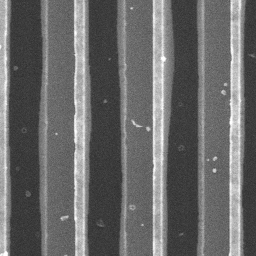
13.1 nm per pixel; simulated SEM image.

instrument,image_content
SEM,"lines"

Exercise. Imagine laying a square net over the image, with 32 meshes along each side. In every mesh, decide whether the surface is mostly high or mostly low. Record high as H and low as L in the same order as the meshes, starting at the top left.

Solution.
HLLLLLHHHHHLLLLHHHHHHLLLLHHHHHLL
HLLLLLHHHHHLLLLHHHHHHLLLLHHHHHLL
HLLLLLHHHHHLLLLHHHHHHLLLLHHHHHLL
HLLLLLHHHHHLLLLHHHHHHLLLLHHHHHLL
HLLLLLHHHHHLLLLHHHHHHLLLLHHHHHLL
HLLLLLHHHHHLLLLHHHHHHLLLLHHHHHLL
HLLLLLHHHHHLLLLHHHHHHLLLLHHHHHLL
HLLLLLHHHHHLLLLHHHHHHLLLLHHHHHLL
HLLLLLHHHHHLLLLHHHHHHLLLLHHHHHLL
HLLLLLHHHHHLLLLHHHHHHLLLLHHHHHLL
HLLLLLHHHHHLLLLLHHHHHLLLLHHHHHLL
HLLLLLHHHHHLLLLLHHHHHLLLLHHHHHLL
HLLLLLHHHHHLLLLLHHHHLLLLLHHHHHLL
HLLLLLHHHHHLLLLLHHHHLLLLLHHHHHLL
HLLLLLHHHHHLLLLLHHHHLLLLLHHHHHLL
HLLLLLHHHHHLLLLLHHHHLLLLLHHHHHLL
HLLLLLHHHHHLLLLLHHHHLLLLLHHHHHLL
HLLLLLHHHHHLLLLLHHHHLLLLLHHHHHLL
HLLLLLHHHHHLLLLLHHHHLLLLLHHHHHLL
HLLLLLHHHHHLLLLLHHHHLLLLLHHHHHLL
HLLLLLHHHHHLLLLLHHHHLLLLLHHHHHLL
HLLLLLHHHHHLLLLLHHHHLLLLLHHHHHLL
HLLLLLHHHHHLLLLLHHHHLLLLLHHHHHLL
HLLLLLHHHHHLLLLLHHHHLLLLLHHHHHLL
HLLLLLHHHHHLLLLLHHHHLLLLLHHHHHLL
HLLLLLHHHHHLLLLLHHHHLLLLLHHHHHLL
HLLLLLHHHHHLLLLLHHHHLLLLLHHHHHLL
HLLLLLHHHHHLLLLLHHHHLLLLLHHHHHLL
HLLLLLHHHHHLLLLLHHHHLLLLLHHHHHLL
HLLLLLHHHHHLLLLLHHHHLLLLLHHHHHLL
HLLLLLHHHHHLLLLLHHHHLLLLLHHHHHLL
HLLLLLHHHHHLLLLLHHHHLLLLLHHHHHLL